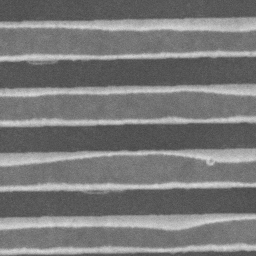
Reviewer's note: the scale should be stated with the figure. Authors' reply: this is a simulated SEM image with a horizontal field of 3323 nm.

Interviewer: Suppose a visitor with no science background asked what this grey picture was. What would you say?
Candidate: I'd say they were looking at lines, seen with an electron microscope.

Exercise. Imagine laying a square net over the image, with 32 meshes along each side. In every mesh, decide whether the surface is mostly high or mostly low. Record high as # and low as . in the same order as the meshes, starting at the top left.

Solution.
................................
................................
................................
################################
################################
################################
################################
###.............................
................................
................................
................................
....############################
################################
################################
################################
##############..................
................................
................................
................................
.......#########################
################################
################################
################################
#################...............
................................
................................
................................
........................########
################################
################################
################################
##########......................